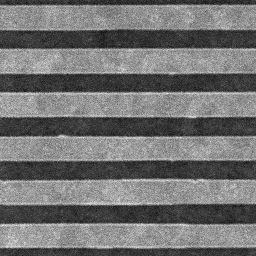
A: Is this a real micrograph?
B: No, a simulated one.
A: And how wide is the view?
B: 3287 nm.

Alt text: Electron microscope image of parallel lines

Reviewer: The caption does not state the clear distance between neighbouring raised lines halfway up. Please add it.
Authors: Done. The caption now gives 266 nm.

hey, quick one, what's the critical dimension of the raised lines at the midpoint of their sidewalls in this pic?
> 292 nm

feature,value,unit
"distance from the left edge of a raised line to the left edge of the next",561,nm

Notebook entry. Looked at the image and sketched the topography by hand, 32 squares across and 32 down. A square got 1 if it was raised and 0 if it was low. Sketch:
00000000000000000000000000000000
11111111111111111111111111111111
11111111111111111111111111111111
11111111111111111111111111111111
00000000000000000000000000000000
00000000000000000000000000000000
11111111111111111111111111111111
11111111111111111111111111111111
11111111111111111111111111111111
00000000000000000000000000000000
00000000000000000000000000000000
00000000000000000000000000000000
11111111111111111111111111111111
11111111111111111111111111111111
00000000000000111111111111110000
00000000000000000000000000000000
00000000000000000000000000000000
11111111111111111111111111111111
11111111111111111111111111111111
11111111111111111111111111111111
00000000000000000000000000000000
00000000000000000000000000000000
00000000000000000000000000000000
11111111111111111111111111111111
11111111111111111111111111111111
00000000000000000000000000000000
00000000000000000000000000000000
00000000000000000000000000000000
11111111111111111111111111111111
11111111111111111111111111111111
11111111111111111111111111111111
00000000000000000000000000000000